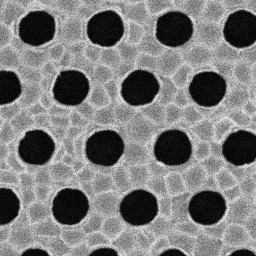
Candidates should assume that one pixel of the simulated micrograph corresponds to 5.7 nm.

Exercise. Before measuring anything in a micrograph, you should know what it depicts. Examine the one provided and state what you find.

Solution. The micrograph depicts a regular array of holes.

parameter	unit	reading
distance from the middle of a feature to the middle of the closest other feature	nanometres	388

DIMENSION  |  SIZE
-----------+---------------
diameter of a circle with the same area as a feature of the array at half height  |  209 nm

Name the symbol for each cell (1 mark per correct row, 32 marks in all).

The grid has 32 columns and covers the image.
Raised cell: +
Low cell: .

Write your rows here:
++++++++++++++++++++++++++++++++
++++..+++++++.+++++++.+++++++..+
+++....++++....+++++....++++....
++.....++++....+++++....++++....
++.....++++....+++++....++++....
+++..+++++++..++++++...++++++...
++++++++++++++++++++++++++++++++
++++++++++++++++++++++++++++++++
++++++++++++++++++++++++++++++++
..+++++....+++++...+++++....++++
...++++....++++.....++++....++++
...++++....++++.....++++....++++
..+++++...++++++...+++++....++++
++++++++++++++++++++++++++++++++
++++++++++++++++++++++++++++++++
++++++++++++++++++++++++++++++++
+++...++++++..++++++...++++++..+
+++....++++....+++++....++++....
++.....++++.....+++.....++++....
+++...+++++....++++.....++++....
++++.+++++++..+++++++..++++++..+
++++++++++++++++++++++++++++++++
++++++++++++++++++++++++++++++++
++++++++++++++++++++++++++++++++
..+++++....+++++...+++++....++++
...++++....++++.....++++....++++
..+++++....++++.....++++....++++
..+++++...++++++...+++++...+++++
++++++++++++++++++++++++++++++++
++++++++++++++++++++++++++++++++
++++++++++++++++++++++++++++++++
+++...++++++..++++++...++++++...